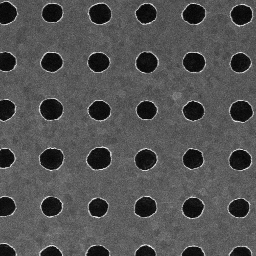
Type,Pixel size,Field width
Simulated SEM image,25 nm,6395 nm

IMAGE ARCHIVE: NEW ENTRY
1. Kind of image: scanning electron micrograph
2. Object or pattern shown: a regular array of holes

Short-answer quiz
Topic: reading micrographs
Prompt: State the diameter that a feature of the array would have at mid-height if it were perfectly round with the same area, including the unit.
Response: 526 nanometres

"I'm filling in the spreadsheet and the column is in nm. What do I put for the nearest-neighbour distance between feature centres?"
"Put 1180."